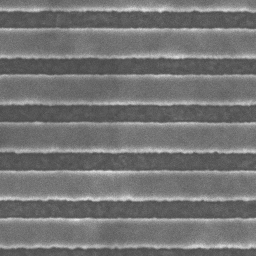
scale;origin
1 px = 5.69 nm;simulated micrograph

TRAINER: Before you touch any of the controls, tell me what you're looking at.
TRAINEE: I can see lines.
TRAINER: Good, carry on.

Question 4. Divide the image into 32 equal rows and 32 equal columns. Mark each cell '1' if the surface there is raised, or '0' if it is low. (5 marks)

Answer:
11111111111111111111111111111111
00000000000000000000000000000001
00000000000000000000000000000000
00000000000000000000000000000000
11111111111111111111111111111111
11111111111111111111111111111111
11111111111111111111111111111111
00000000000000000000000000000000
00000000000000000000000000000000
11111111111111111111111111111111
11111111111111111111111111111111
11111111111111111111111111111111
11111111111111111111111111111111
00000000000000000000000000000000
00000000000000000000000000000000
11111111111111111111111111111111
11111111111111111111111111111111
11111111111111111111111111111111
11111111111111111111111111111111
00000000000000000000000000000000
00000000000000000000000000000000
11111111111111111111111111111111
11111111111111111111111111111111
11111111111111111111111111111111
11111111111111111111111111111111
00000000000000000000000000000000
00000000000000000000000000000000
11111111111111111111111111111111
11111111111111111111111111111111
11111111111111111111111111111111
11111111111111111111111111111111
00000000000000000000000000000000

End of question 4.